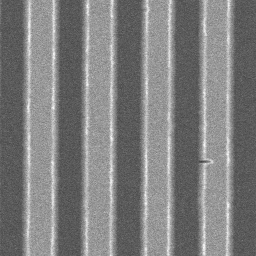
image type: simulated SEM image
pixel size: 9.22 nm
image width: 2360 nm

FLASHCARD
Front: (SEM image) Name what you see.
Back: parallel lines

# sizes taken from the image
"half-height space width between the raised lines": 264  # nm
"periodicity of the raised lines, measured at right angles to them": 539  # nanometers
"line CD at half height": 280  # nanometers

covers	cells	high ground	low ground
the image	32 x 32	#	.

...####....###....####...####...
...####....###....####...####...
...####....###....####...####...
...####....###....####...####...
...####....###....####...####...
...####....###....###....####...
...####....###....####...####...
...####....###....###....####...
...####....###....####...####...
...####....###....####...####...
...####....###....###....####...
...####....###....###....####...
...####....###....####...####...
...####...####....###....####...
...####...####....###....####...
...####....###....####...####...
...####...####....####...####...
...####...####....###....####...
...####...####....###....####...
...####....###....####...####...
...####...####....###....####...
...####...####....###....####...
...####....###....###....####...
...####...####....###....####...
...####...####....###....####...
...####...####....####...####...
...####...####....###....####...
...####...####....####...####...
...####...####....###....####...
...####...####....###....####...
...####...####....###....####...
...####...####....###....####...